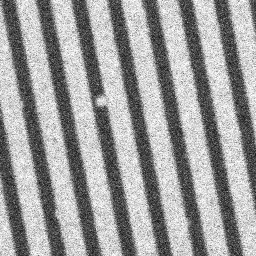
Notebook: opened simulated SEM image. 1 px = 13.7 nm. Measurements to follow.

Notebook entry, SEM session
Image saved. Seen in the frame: parallel lines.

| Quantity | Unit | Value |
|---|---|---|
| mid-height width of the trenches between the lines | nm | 219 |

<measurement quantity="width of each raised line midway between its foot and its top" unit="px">18.5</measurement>